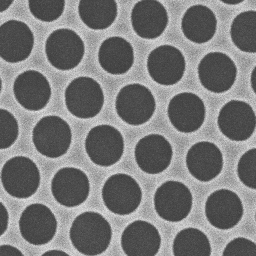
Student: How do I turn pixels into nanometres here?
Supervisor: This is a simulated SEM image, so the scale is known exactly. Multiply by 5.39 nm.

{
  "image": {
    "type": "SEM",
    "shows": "a regular array of holes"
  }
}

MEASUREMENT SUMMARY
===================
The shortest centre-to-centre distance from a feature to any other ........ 273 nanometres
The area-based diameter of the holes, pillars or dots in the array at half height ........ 216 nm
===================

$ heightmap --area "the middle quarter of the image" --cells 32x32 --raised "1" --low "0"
00011111100000000111100000000011
01111111110000001111100000000011
11111111111100011111100000000011
11100001111111111111110000000111
11000000111111111111111000000111
10000000011111100000111111111111
00000000001111000000011111111111
00000000001110000000001111110000
00000000001110000000000111100000
00000000001110000000000111000000
10000000001110000000000111000000
10000000011110000000000111000000
11000000111110000000001111000000
11100001111111000000001111000000
01111111111111100000111111100000
01111111000011111111111111100000
00111110000000111111111111110000
00111100000000111111100011111111
00111000000000011110000001111111
00111000000000011100000000111111
00111000000000011100000000011111
01111000000000011100000000011110
11111100000000011100000000011110
11111100000000111100000000011100
11111110000001111100000000011100
11111111100011111110000000111110
00001111111111111110000001111110
00000111111110011111100111111111
00000011111000000111111111111111
00000011110000000011111110000111
00000011110000000001111100000001
00000001100000000001111000000001